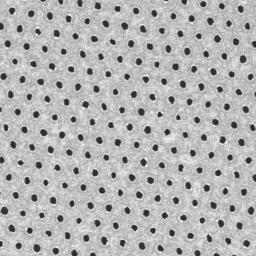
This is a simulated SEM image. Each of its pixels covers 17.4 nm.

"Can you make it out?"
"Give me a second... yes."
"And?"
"a regular array of holes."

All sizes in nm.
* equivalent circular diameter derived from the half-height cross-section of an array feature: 116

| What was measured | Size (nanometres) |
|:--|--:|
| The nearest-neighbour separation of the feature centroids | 322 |